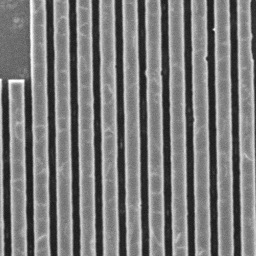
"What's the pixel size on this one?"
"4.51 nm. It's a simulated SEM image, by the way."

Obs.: parallel lines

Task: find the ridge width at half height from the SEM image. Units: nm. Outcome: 68.2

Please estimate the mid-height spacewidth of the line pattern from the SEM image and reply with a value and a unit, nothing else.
34.4 nm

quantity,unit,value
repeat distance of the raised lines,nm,104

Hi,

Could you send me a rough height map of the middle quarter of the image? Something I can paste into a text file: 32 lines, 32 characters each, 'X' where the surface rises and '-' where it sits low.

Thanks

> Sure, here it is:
X--XXXX--XXXX--XXX---XXX---XXX--
X--XXXX--XXXX--XXXX--XXX---XXX--
X--XXXX--XXXX--XXXX--XXX---XXX--
X--XXXX--XXXX--XXXX--XXX---XXX--
X--XXXX--XXXX--XXXX--XXX--XXXX--
X---XXX--XXXX--XXXX--XXX--XXXX--
X---XXX--XXXX--XXXX--XXX--XXXX--
X--XXXX--XXXX--XXXX--XXX---XXX--
X---XXX--XXXX--XXXX--XXX--XXXX--
X---XXX--XXXX--XXXX--XXX---XXX--
X---XXX--XXXX--XXXX--XXX---XXX--
X---XXX--XXXX--XXXX--XXXX-XXXX--
X---XXX--XXXX--XXXX--XXX---XXX--
X---XXX--XXXX--XXXX--XXXX--XXX--
X---XXX---XXX--XXXX--XXX---XXX--
X---XXX---XXX--XXXX--XXXX--XXX--
XX--XXX---XXX--XXXX--XXXX--XXX--
XX--XXX---XXX--XXXX--XXX---XXX--
XX--XXX---XXX--XXXX--XXX---XXX--
XX--XXX---XXX--XXXX--XXXX--XXX--
XX--XXX---XXX--XXXX--XXXX--XXX--
XX--XXXX--XXX--XXXX--XXXX--XXX--
XX--XXXX--XXX--XXXX--XXXX--XXX--
XX--XXXX--XXX--XXXX--XXXX--XXX--
XX--XXXX--XXX--XXXX--XXXX--XXX--
XX--XXXX--XXX--XXXX--XXXX--XXX--
XX--XXXX--XXX--XXXX--XXXX--XXX--
XX--XXXX--XXX--XXXX--XXXX--XXXX-
XX--XXXX--XXX--XXXX--XXXX--XXXX-
XX--XXXX--XXX--XXXX--XXXX--XXXX-
XX--XXXX--XXX--XXXX--XXXX--XXXX-
XX--XXXX--XXX--XXXX--XXXX--XXXX-